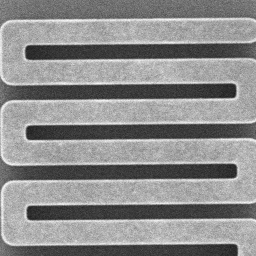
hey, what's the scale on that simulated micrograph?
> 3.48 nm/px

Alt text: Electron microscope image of groups of lines, slits or small figures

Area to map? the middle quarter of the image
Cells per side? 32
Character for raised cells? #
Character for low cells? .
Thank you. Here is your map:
################################
################################
################################
################################
################################
................................
................................
................................
................................
################################
################################
################################
################################
################################
################################
................................
................................
................................
................................
################################
################################
################################
################################
################################
################################
................................
................................
................................
................................
################################
################################
################################